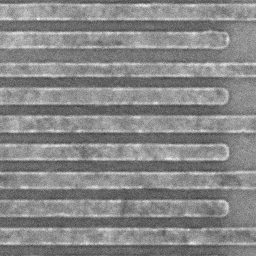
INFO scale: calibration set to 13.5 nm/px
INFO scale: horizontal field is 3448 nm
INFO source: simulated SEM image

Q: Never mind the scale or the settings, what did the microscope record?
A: parallel lines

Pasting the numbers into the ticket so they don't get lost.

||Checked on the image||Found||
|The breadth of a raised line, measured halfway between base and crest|210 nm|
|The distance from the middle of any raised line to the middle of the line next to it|378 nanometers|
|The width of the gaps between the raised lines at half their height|163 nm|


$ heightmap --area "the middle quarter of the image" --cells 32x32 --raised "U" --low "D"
UUUUUUUUUUUUUUUUUUUUUUUUUUUUUUUU
UUUUUUUUUUUUUUUUUUUUUUUUUUUUUUUU
UUUUUUUUUUUUUUUUUUUUUUUUUUUUUUUU
DDDDDDDDDDDDDDDDDDDDDDDDDDDDDDDD
DDDDDDDDDDDDDDDDDDDDDDDDDDDDDDDD
DDDDDDDDDDDDDDDDDDDDDDDDDDDDDDDD
UUUUUUUUUUUUUUUUUUUUUUUUUUUUUUUU
UUUUUUUUUUUUUUUUUUUUUUUUUUUUUUUU
UUUUUUUUUUUUUUUUUUUUUUUUUUUUUUUU
UUUUUUUUUUUUUUUUUUUUUUUUUUUUUUUU
DDDDDDDDDDDDDDDDDDDDDDDDDDDDDDDD
DDDDDDDDDDDDDDDDDDDDDDDDDDDDDDDD
DDDDDDDDDDDDDDDDDDDDDDDDDDDDDDDD
UUUUUUUUUUUUUUUUUUUUUUUUUUUUUUUU
UUUUUUUUUUUUUUUUUUUUUUUUUUUUUUUU
UUUUUUUUUUUUUUUUUUUUUUUUUUUUUUUU
UUUUUUUUUUUUUUUUUUUUUUUUUUUUUUUU
DDDDDDDDDDDDDDDDDDDDDDDDDDDDDDDD
DDDDDDDDDDDDDDDDDDDDDDDDDDDDDDDD
DDDDDDDDDDDDDDDDDDDDDDDDDDDDDDDD
UUUUUUUUUUUUUUUUUUUUUUUUUUUUUUUU
UUUUUUUUUUUUUUUUUUUUUUUUUUUUUUUU
UUUUUUUUUUUUUUUUUUUUUUUUUUUUUUUU
UUUUUUUUUUUUUUUUUUUUUUUUUUUUUUUU
DDDDDDDDDDDDDDDDDDDDDDDDDDDDDDDD
DDDDDDDDDDDDDDDDDDDDDDDDDDDDDDDD
DDDDDDDDDDDDDDDDDDDDDDDDDDDDDDDD
UUUUUUUUUUUUUUUUUUUUUUUUUUUUUUUU
UUUUUUUUUUUUUUUUUUUUUUUUUUUUUUUU
UUUUUUUUUUUUUUUUUUUUUUUUUUUUUUUU
UUUUUUUUUUUUUUUUUUUUUUUUUUUUUUUU
DDDDDDDDDDDDDDDDDDDDDDDDDDDDDDDD